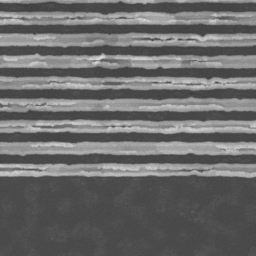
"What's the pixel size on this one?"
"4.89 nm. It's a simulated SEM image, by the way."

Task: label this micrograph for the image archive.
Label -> parallel lines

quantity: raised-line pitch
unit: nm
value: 106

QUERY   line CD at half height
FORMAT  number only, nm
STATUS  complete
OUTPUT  48.3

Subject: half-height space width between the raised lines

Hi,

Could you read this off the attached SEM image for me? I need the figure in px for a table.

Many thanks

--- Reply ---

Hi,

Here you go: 11.8